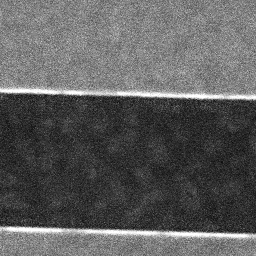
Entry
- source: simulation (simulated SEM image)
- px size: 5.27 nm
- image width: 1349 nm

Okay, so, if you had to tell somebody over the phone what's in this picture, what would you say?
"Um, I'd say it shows one or a few lines or trenches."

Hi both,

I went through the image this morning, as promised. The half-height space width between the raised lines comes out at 0.716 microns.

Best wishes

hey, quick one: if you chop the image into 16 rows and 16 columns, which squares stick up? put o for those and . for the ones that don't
oooooooooooooooo
oooooooooooooooo
oooooooooooooooo
oooooooooooooooo
oooooooooooooooo
oooooooooooooooo
................
................
................
................
................
................
................
................
ooooooooo.......
oooooooooooooooo